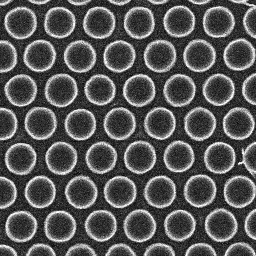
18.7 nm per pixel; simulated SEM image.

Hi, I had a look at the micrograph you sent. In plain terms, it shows a regular array of raised bodies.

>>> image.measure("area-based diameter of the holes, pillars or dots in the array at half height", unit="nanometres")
566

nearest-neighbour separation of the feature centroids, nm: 721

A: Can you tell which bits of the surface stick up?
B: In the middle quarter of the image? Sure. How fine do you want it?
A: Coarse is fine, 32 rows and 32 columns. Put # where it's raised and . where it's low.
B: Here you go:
.######....######....######....#
..####.......##........##.......
................................
##.....####......####......####.
###...######....######....######
###...#######..#######...#######
###...#######..#######...#######
###...#######..#######...#######
###...######...#######....######
##.....####.....#####.....#####.
................................
............###........###......
.######....######....######....#
.######....######...#######....#
.#######..########..#######....#
.#######..########...######....#
.#######..#######....######....#
.######....######....######....#
..####......###........##.......
..................##........##..
##.....#####....######....#####.
##....#######...######....######
###...#######..########..#######
###...#######..########..#######
###...#######..########..#######
##....######....######....#####.
##.....####......####......###..
................................
...###......####.......###......
..#####....######....######....#
.#######...#######...#######...#
.#######..########...#######..##